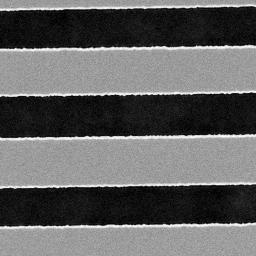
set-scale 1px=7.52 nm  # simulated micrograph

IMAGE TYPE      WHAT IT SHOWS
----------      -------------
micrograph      lines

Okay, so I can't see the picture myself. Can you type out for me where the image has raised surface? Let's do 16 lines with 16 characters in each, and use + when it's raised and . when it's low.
++++++++++......
................
................
++++++++++++++++
++++++++++++++++
++++++++++++++++
................
................
.........+.+++++
++++++++++++++++
++++++++++++++++
++++++++++++++++
................
................
++++++++++++++++
++++++++++++++++